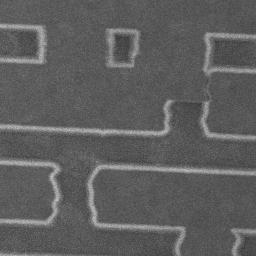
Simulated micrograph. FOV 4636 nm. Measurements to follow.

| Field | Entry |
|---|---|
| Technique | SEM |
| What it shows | one or a few lines or trenches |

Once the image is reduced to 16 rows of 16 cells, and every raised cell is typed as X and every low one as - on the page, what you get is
XXXXXXXXXXXXXXXX
XXXXXXXXXXXXXXXX
---XXXX--XXXX---
---XXXX-XXXXX---
XXXXXXXXXXXXXXXX
XXXXXXXXXXXXXXXX
XXXXXXXXXXX--XXX
XXXXXXXXXX---XXX
--------------XX
----------------
XXX---XX--------
XXX---XXXXXXXXXX
XXX---XXXXXXXXXX
XXX---XXXXXXXXXX
-----------XXXX-
-----------XXXX-